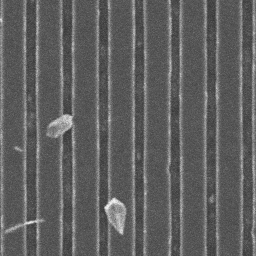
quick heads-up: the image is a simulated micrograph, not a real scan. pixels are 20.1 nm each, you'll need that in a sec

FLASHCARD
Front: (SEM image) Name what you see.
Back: parallel lines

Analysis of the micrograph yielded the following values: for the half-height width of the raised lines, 0.525 micrometres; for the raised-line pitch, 0.723 microns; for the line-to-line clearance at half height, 196 nm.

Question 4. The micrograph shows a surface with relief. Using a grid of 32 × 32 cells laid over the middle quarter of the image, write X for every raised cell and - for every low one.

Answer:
--XXXXXXX--XXXXXXX--XXXXXXX--XXX
--XXXXXXX--XXXXXXX--XXXXXXX--XXX
--XXXXXXX--XXXXXXX--XXXXXX---XXX
--XXXXXXX--XXXXXXX--XXXXXX---XXX
--XXXXXXX--XXXXXXX--XXXXXX---XXX
--XXXXXXX--XXXXXXX--XXXXXX---XXX
--XXXXXXX--XXXXXXX--XXXXXX---XXX
--XXXXXXX--XXXXXXX--XXXXXX---XXX
--XXXXXXX--XXXXXXX--XXXXXX---XXX
--XXXXXXX--XXXXXXX--XXXXXX---XXX
--XXXXXXX--XXXXXXX--XXXXXX---XXX
--XXXXXXX--XXXXXXX--XXXXXX---XXX
--XXXXXXX--XXXXXXX--XXXXXX---XXX
XXXXXXXXX--XXXXXXX--XXXXXX---XXX
XXXXXXXXX--XXXXXXX--XXXXXX---XXX
XXXXXXXXX--XXXXXXX--XXXXXX---XXX
X-XXXXXXX--XXXXXXX--XXXXXX---XXX
--XXXXXXX--XXXXXXX--XXXXXX---XXX
--XXXXXXX--XXXXXXX--XXXXXX---XXX
--XXXXXXX--XXXXXXX--XXXXXX---XXX
--XXXXXXX--XXXXXXX--XXXXXX---XXX
--XXXXXXX--XXXXXXX--XXXXXX---XXX
--XXXXXXX--XXXXXXX--XXXXXX---XXX
--XXXXXXX--XXXXXXX--XXXXXX---XXX
--XXXXXXX--XXXXXXX--XXXXXX---XXX
--XXXXXXX--XXXXXXX--XXXXXX---XXX
--XXXXXXX--XXXXXXX--XXXXXX---XXX
--XXXXXXX--XXXXXXX--XXXXXX---XXX
--XXXXXXX--XXXXXXX--XXXXXX---XXX
--XXXXXXX--XXXXXXX--XXXXXX---XXX
--XXXXXXX--XXXXXXX--XXXXXXX--XXX
--XXXXXXX--XXXXXXX--XXXXXXX--XXX